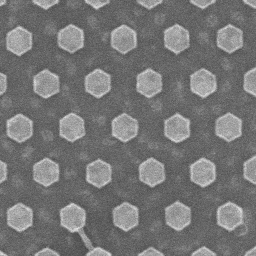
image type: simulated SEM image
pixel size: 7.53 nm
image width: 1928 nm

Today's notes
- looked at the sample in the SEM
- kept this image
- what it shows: a regular array of raised bodies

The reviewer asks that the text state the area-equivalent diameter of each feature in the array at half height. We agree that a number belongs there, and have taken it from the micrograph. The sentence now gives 25.8 pixels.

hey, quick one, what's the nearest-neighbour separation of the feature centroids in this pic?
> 384 nanometers